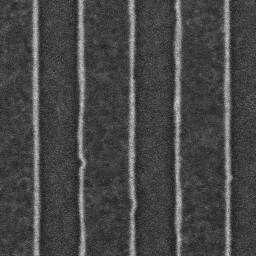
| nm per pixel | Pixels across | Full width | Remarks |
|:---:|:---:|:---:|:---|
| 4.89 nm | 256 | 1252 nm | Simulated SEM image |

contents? one or a few lines or trenches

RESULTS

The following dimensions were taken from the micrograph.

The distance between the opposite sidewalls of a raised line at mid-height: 248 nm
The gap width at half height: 45.3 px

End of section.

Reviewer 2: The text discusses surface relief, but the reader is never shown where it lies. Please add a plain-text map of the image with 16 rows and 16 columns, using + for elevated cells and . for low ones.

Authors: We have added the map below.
++...+++...+++..
++...+++...+++..
++...+++...+++..
++...+++...+++..
++...+++...+++..
++...+++...+++..
++...+++...+++..
++...+++...+++..
++...+++...+++..
++...+++...+++..
++...+++...+++..
++...+++...+++..
++...+++...+++..
++...+++...+++..
++...+++...+++..
++...+++...+++..